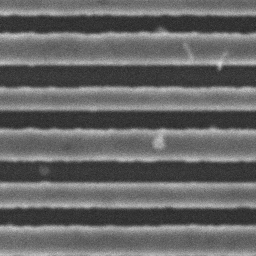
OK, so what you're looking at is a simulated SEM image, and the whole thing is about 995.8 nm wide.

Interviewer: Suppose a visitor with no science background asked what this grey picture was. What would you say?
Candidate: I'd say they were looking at lines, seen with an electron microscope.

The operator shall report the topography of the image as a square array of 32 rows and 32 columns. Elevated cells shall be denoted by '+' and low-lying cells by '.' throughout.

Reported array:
++++++++++++++++++++++++++++++++
++++++++++++++++++++++++++++++++
................................
................................
++++++++++++++++++++++++++++++++
++++++++++++++++++++++++++++++++
++++++++++++++++++++++++++++++++
++++++++++++++++++++++++++++++++
................................
................................
................................
++++++++++++++++++++++++++++++++
++++++++++++++++++++++++++++++++
++++++++++++++++++++++++++++++++
................................
................................
++++++++++++++++++++++++++++++++
++++++++++++++++++++++++++++++++
++++++++++++++++++++++++++++++++
++++++++++++++++++++++++++++++++
................................
................................
................................
++++++++++++++++++++++++++++++++
++++++++++++++++++++++++++++++++
++++++++++++++++++++++++++++++++
................................
................................
++++++++++++++++++++++++++++++++
++++++++++++++++++++++++++++++++
++++++++++++++++++++++++++++++++
++++++++++++++++++++++++++++++++